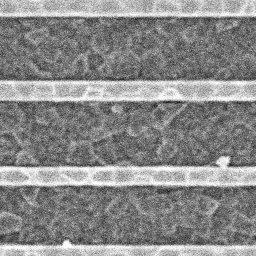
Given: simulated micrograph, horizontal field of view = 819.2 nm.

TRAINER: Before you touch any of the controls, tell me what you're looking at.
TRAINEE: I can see one or a few lines or trenches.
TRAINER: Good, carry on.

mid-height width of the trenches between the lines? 209 nm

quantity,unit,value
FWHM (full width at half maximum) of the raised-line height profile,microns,0.0596